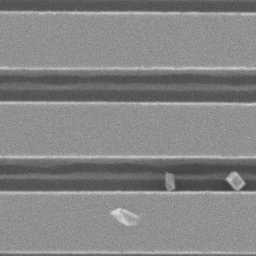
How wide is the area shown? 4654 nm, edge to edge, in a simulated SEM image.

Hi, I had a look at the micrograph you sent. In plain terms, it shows lines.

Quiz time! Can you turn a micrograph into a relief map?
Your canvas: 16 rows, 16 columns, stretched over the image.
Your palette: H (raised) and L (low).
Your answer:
LLLLLLLLLLLLLLLL
HHHHHHHHHHHHHHHH
HHHHHHHHHHHHHHHH
HHHHHHHHHHHHHHHH
LLLLLLLLLLLLLLLL
LLLLLLLLLLLLLLLL
HHHHHHHHHHHHHHHH
HHHHHHHHHHHHHHHH
HHHHHHHHHHHHHHHH
HHHHHHHHHHHHHHHH
LLLLLLLLLLLLLLLL
LLLLLLLLLLHLLLHL
HHHHHHHHHHHHHHHH
HHHHHHHHHHHHHHHH
HHHHHHHHHHHHHHHH
HHHHHHHHHHHHHHHH